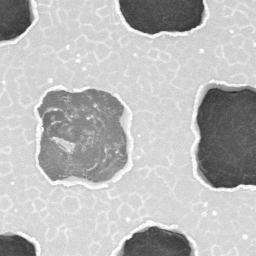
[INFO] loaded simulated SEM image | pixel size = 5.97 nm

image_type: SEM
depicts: holes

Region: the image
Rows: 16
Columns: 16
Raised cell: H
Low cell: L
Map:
LLHHHHHHLLLLLHHH
LLHHHHHHLLLLHHHH
HHHHHHHHHHHHHHHH
HHHHHHHHHHHHHHHH
HHHHHHHHHHHHHHHH
HHHHHHHHHHHHHLLL
HHHLLLLLHHHHHLLL
HHHLLLLLHHHHLLLL
HHHLLLLLHHHHHLLL
HHLLLLLLHHHHLLLL
HHHLLLLLHHHHLLLL
HHHHHHHHHHHHHLLL
HHHHHHHHHHHHHHHH
HHHHHHHHHHHHHHHH
HHHHHHHHHLLHHHHH
LLHHHHHHLLLLHHHH